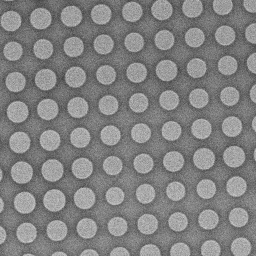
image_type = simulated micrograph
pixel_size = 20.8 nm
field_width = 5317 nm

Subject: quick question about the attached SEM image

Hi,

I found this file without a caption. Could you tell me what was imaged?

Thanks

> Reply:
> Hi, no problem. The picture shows an array of small figures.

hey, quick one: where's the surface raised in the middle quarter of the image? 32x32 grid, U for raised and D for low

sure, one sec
DDDDDDDDDDDDDDDDUUUUDDDUUUUUDDDU
DUUUUDDDDUUUDDDDUUUUDDDUUUUUDDDU
DUUUUDDDUUUUUDDDUUUUUDDUUUUUDDDU
UUUUUDDDUUUUUDDDUUUUDDDDUUUDDDDD
DUUUUDDDDUUUDDDDDDDDDDDDDDDDDDDD
DDUUDDDDDDDDDDDDDDDDDDDDDDDDDDDD
DDDDDDDDDDDDDDDDDDDDDDDDDDDDDDDD
DDDDDDDDDDDDDDDDDDUDDDDDDUUUDDDD
DDDUDDDDDDUUUDDDDUUUUDDDUUUUUDDD
DUUUUUDDDUUUUDDDUUUUUDDDUUUUUDDD
DUUUUUDDDUUUUDDDUUUUUDDDUUUUDDDD
DUUUUUDDDUUUUDDDDUUUDDDDDDDDDDDD
DDUUUDDDDDUUDDDDDDDDDDDDDDDDDDDD
DDDDDDDDDDDDDDDDDDDDDDDDDDDDDDDD
DDDDDDDDDDDDDDDDDDDDDDDDDDDDDDDD
DDDDDDDDDDDDDDDDDDUUUDDDDUUUUDDD
DDDUUDDDDDUUUUDDDUUUUDDDDUUUUDDD
DDUUUUDDDUUUUUDDDUUUUUDDDUUUUDDD
DDUUUUDDDUUUUUDDDUUUUDDDDUUUDDDD
DDUUUUDDDDUUUDDDDDDUDDDDDDDDDDDD
DDDUUDDDDDDDDDDDDDDDDDDDDDDDDDDD
DDDDDDDDDDDDDDDDDDDDDDDDDDDDDDDD
DDDDDDDDDDDDDDDDDDDDDDDDDDUUUDDD
DDDDDDDDDDDUUDDDDDUUUUDDDUUUUUDD
DDDUUUUDDDUUUUDDDDUUUUDDDUUUUUDD
DDUUUUUDDDUUUUDDDDUUUUDDDUUUUUDD
DDUUUUUDDDUUUUDDDDUUUUDDDDUUDDDD
DDUUUUUDDDDUUDDDDDDDDDDDDDDDDDDD
DDDDDDDDDDDDDDDDDDDDDDDDDDDDDDDD
DDDDDDDDDDDDDDDDDDDDDDDDDDDDDDDD
DDDDDDDDDDDDDDDDDDDUUUDDDDUUUUDD
DDDDUUUDDDDUUUDDDDUUUUDDDDUUUUDD